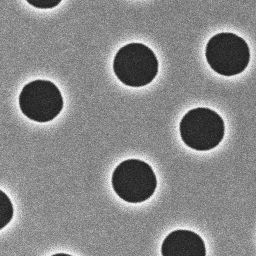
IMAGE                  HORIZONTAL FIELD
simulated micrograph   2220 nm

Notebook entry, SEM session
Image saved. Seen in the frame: holes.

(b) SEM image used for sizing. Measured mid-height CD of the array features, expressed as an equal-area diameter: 44.6 px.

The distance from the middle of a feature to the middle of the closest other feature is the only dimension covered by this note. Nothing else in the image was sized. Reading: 0.742 µm